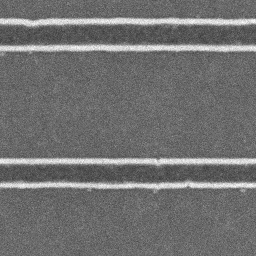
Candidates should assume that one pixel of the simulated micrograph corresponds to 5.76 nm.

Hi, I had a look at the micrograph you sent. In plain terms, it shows one or a few lines or trenches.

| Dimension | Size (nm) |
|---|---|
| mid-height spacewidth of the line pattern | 650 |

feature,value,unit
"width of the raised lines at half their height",0.149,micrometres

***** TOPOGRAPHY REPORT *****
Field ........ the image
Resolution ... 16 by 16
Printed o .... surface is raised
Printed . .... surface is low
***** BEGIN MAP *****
................
oooooooooooooooo
oooooooooooooooo
................
................
................
................
................
................
................
oooooooooooooooo
oooooooooooooooo
................
................
................
................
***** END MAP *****